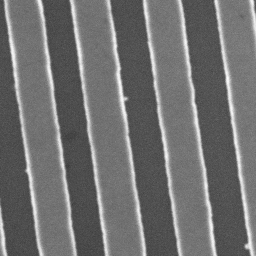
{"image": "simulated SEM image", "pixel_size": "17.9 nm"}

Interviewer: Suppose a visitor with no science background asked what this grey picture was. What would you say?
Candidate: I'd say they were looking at lines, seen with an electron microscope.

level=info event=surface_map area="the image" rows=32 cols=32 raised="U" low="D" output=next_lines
DUUUUDDDDUUUUUDDDDUUUUUDDDDUUUUU
DUUUUDDDDUUUUUDDDDUUUUUDDDDUUUUU
DUUUUDDDDUUUUUDDDDUUUUUDDDDUUUUU
DUUUUUDDDUUUUUDDDDUUUUUDDDDUUUUU
DUUUUUDDDUUUUUDDDDDUUUUDDDDDUUUU
DUUUUUDDDDUUUUDDDDDUUUUDDDDDUUUU
DDUUUUDDDDUUUUUDDDDUUUUDDDDDUUUU
DDUUUUDDDDUUUUUDDDDUUUUUDDDDUUUU
DDUUUUDDDDUUUUUDDDDUUUUUDDDDUUUU
DDUUUUDDDDUUUUUDDDDUUUUUDDDDUUUU
DDUUUUUDDDUUUUUDDDDUUUUUDDDDUUUU
DDUUUUUDDDUUUUUDDDDDUUUUDDDDDUUU
DDUUUUUDDDDUUUUDDDDDUUUUDDDDDUUU
DDUUUUUDDDDUUUUDDDDDUUUUDDDDDUUU
DDDUUUUDDDDUUUUUDDDDUUUUUDDDDUUU
DDDUUUUDDDDUUUUUDDDDUUUUUDDDDUUU
DDDUUUUDDDDUUUUUDDDDUUUUUDDDDUUU
DDDUUUUUDDDUUUUUDDDDUUUUUDDDDUUU
DDDUUUUUDDDUUUUUDDDDDUUUUDDDDDUU
DDDUUUUUDDDDUUUUDDDDDUUUUDDDDDUU
DDDUUUUUDDDDUUUUUDDDDUUUUDDDDDUU
DDDDUUUUDDDDUUUUUDDDDUUUUUDDDDUU
DDDDUUUUDDDDUUUUUDDDDUUUUUDDDDUU
DDDDUUUUDDDDUUUUUDDDDUUUUUDDDDUU
DDDDUUUUUDDDUUUUUDDDDUUUUUDDDDUU
DDDDUUUUUDDDUUUUUDDDDDUUUUDDDDUU
DDDDUUUUUDDDDUUUUDDDDDUUUUDDDDDU
DDDDUUUUUDDDDUUUUUDDDDUUUUDDDDDU
DDDDUUUUUDDDDUUUUUDDDDUUUUUDDDDU
DDDDDUUUUDDDDUUUUUDDDDUUUUUDDDDU
UDDDDUUUUDDDDUUUUUDDDDUUUUUDDDDU
UDDDDUUUUDDDDUUUUUDDDDUUUUUDDDDU